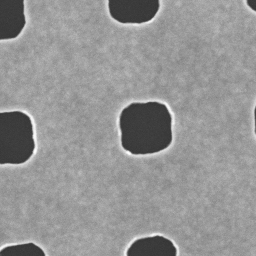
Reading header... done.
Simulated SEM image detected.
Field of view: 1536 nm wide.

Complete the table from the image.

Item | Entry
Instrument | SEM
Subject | holes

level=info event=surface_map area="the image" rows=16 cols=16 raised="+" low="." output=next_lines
.++++++...++++++
..++++++++++++++
++++++++++++++++
++++++++++++++++
++++++++++++++++
++++++++++++++++
++++++++..++++++
..++++++...+++++
..++++++...+++++
..++++++..++++++
++++++++++++++++
++++++++++++++++
++++++++++++++++
++++++++++++++++
++++++++++++++++
..++++++...+++++